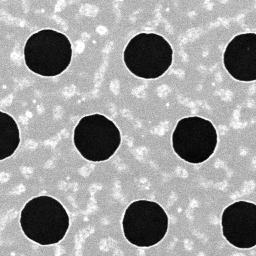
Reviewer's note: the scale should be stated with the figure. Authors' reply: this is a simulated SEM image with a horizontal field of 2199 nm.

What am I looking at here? holes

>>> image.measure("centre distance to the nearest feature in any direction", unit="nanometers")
834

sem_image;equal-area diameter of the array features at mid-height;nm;406